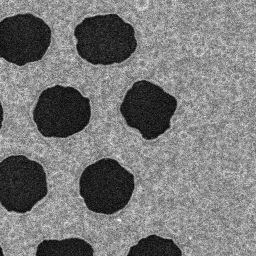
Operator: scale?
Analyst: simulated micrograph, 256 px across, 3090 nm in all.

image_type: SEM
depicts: holes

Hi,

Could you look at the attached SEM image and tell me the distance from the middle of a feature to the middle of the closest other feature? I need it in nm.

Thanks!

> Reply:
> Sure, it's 1000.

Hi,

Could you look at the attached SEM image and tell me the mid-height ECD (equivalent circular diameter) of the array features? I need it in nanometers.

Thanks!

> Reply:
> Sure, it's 671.